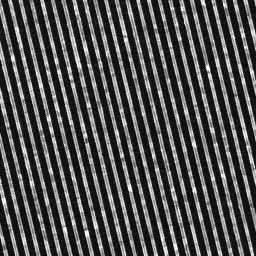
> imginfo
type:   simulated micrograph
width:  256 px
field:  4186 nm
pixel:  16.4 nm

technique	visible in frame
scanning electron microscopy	parallel lines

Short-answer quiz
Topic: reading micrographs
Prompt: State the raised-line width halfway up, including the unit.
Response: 43.8 nm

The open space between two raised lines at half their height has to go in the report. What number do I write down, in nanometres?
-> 119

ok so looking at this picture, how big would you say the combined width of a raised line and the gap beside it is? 170 nm